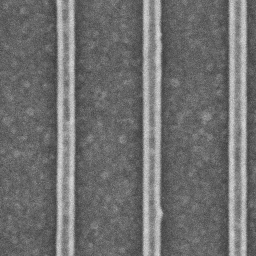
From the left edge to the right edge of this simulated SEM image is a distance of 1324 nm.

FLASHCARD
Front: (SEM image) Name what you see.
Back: one or a few lines or trenches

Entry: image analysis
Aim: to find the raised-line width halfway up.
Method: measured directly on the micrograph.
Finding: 62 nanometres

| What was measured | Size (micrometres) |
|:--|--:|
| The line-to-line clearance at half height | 0.38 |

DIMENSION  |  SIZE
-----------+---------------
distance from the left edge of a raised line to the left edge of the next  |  444 nm